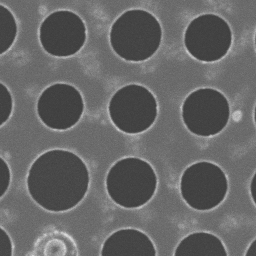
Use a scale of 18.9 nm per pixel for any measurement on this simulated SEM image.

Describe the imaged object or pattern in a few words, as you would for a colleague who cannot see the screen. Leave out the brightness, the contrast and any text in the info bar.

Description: a regular array of holes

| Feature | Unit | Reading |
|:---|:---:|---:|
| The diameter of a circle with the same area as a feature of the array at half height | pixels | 47.9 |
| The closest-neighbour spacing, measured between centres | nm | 1370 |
